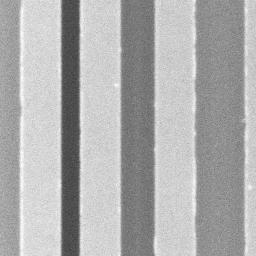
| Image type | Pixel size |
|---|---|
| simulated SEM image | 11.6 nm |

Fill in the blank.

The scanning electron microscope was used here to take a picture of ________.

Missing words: lines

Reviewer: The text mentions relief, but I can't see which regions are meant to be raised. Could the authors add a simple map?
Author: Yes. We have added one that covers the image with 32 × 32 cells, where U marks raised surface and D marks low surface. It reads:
DDDUUUUUDDUUUUUDDDDUUUUUDDDDDDDU
DDDUUUUUDDUUUUUDDDDUUUUUDDDDDDDU
DDDUUUUUDDUUUUUDDDDUUUUUDDDDDDDU
DDDUUUUUDDUUUUUDDDDUUUUUDDDDDDDU
DDDUUUUUDDUUUUUDDDDUUUUUDDDDDDDU
DDDUUUUUDDUUUUUDDDDUUUUUDDDDDDDU
DDDUUUUUDDUUUUUDDDDUUUUUDDDDDDDU
DDDUUUUUDDUUUUUDDDDUUUUUDDDDDDDU
DDDUUUUUDDUUUUUDDDDUUUUUDDDDDDDU
DDDUUUUUDDUUUUUDDDDUUUUUDDDDDDDU
DDDUUUUUDDUUUUUDDDDUUUUUDDDDDDDU
DDDUUUUUDDUUUUUDDDDUUUUUDDDDDDDU
DDDUUUUUDDUUUUUDDDDUUUUUDDDDDDDU
DDDUUUUUDDUUUUUDDDDUUUUUDDDDDDDU
DDDUUUUUDDUUUUUDDDDUUUUUDDDDDDDU
DDDUUUUUDDUUUUUDDDDUUUUUDDDDDDDU
DDDUUUUUDDUUUUUDDDDUUUUUDDDDDDDU
DDDUUUUUDDUUUUUDDDDUUUUUDDDDDDDU
DDDUUUUUDDUUUUUDDDDUUUUUDDDDDDDU
DDDUUUUUDDUUUUUDDDDUUUUUDDDDDDDU
DDDUUUUUDDUUUUUDDDDUUUUUDDDDDDDU
DDDUUUUUDDUUUUUDDDDUUUUUDDDDDDDU
DDDUUUUUDDUUUUUDDDDUUUUUDDDDDDDU
DDDUUUUUDDUUUUUDDDDUUUUUDDDDDDDU
DDDUUUUUDDUUUUUDDDDUUUUUDDDDDDDU
DDDUUUUUDDUUUUUDDDDUUUUUDDDDDDDU
DDDUUUUUDDUUUUUDDDDUUUUUDDDDDDDU
DDDUUUUUDDUUUUUDDDDUUUUUDDDDDDDU
DDDUUUUUDDUUUUUDDDDUUUUUDDDDDDDU
DDDUUUUUDDUUUUUDDDDUUUUUDDDDDDDU
DDDUUUUUDDUUUUUDDDDUUUUUDDDDDDDU
DDDUUUUUDDUUUUUDDDDUUUUUDDDDDDDU